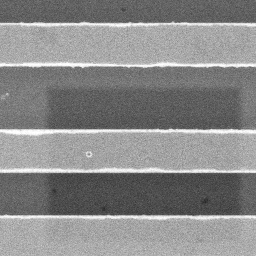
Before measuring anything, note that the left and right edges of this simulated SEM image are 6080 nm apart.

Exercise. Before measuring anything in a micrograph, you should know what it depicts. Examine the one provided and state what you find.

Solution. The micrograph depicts lines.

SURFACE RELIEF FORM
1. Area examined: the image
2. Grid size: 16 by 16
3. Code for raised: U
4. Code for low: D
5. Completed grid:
DDDDDDDDDDDDDDDD
UUUUUUUDUUUUUUUU
UUUUUUUUUUUUUUUU
UUUUUUUUUUUUUUUU
DDDDDDDDDDDDDDDD
DDDDDDDDDDDDDDDD
DDDDDDDDDDDDDDDD
DDDDDDDDDDDDDDDD
UUUUUUUUUUUUUUUU
UUUUUUUUUUUUUUUU
UUUUUUUUUUUUUUUU
DDDDDDDDDDDDDDDD
DDDDDDDDDDDDDDDD
DDDDDDDDDDDDDDDD
UUUUUUUUUUUUUUUU
UUUUUUUUUUUUUUUU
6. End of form